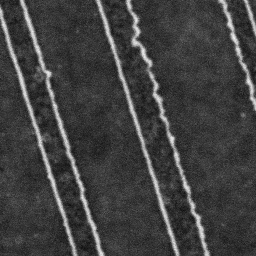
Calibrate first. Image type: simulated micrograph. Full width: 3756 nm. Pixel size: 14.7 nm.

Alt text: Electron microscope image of one or a few lines or trenches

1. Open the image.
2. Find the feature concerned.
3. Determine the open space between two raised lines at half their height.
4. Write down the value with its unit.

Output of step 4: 1060 nanometers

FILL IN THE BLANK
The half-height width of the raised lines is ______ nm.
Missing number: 387